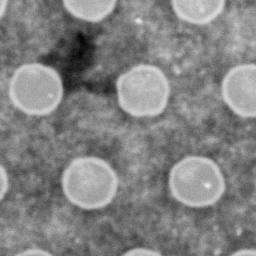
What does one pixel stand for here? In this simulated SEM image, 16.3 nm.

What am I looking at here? raised bodies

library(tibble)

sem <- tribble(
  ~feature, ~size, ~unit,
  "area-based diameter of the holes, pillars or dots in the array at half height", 811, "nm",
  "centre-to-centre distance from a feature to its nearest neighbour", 1720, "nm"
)